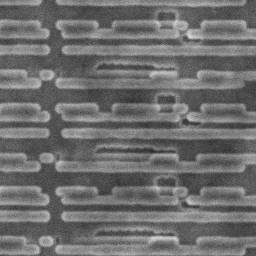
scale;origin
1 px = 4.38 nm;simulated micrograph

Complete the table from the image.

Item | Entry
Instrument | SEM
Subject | wiring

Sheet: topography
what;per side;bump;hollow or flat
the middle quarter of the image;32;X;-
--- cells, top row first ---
--------------------------------
--------------------------------
----------------------XXXXXX----
---------------------XXXXXXX----
XXXXXXXXXXXXXXXXXXXXXXXXXXXXXXXX
XXXXXXXXXXXXXXXXXXXXXXXXXXXXXXXX
--------------------------------
--------------------------------
--------------------------------
--------------------------------
XXXXXXXX----XXXXXXXXXXXX----XXX-
XXXXXXXX----XXXXXXXXXXXX---XXXX-
XXXXXXXXXXXXXXXXXXXXXXXXXXXXX--X
XXXXXXXXXXXXXXXXXXXXXXXXXXXXX--X
--------------------------------
--------------------------------
XXXXXXXXXXX--XXXX-XXXXX-XXXXXXXX
XXXXXXXXXXXXXXXXXXXXXXXXXXXXXXXX
----------------------------XXXX
--------------------------------
--------------------------------
--------------------------------
--------------------------------
---------------------XXXXXXX----
XXXXXXXXXXXXXX------XXXXXXXXXX--
XXXXXXXXXXXXXXXXXXXXXXXXXXXXXXXX
XXXXXXXXXXXXXXXXXXXXXXXXXXXXXXXX
--------------------------------
--------------------------------
--------------------------------
--------------------------------
XXXXXXXX----XXXXXXXXXXXX---XXXX-